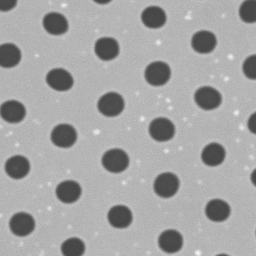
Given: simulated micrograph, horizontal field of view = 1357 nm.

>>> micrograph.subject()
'a regular array of holes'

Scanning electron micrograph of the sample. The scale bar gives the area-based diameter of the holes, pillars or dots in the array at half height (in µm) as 0.128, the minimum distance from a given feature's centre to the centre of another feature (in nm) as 296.